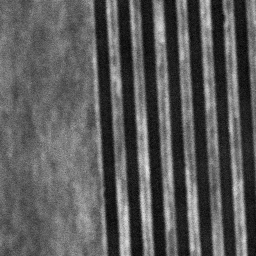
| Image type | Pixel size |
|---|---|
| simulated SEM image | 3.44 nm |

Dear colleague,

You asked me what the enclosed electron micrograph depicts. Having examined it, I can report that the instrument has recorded parallel lines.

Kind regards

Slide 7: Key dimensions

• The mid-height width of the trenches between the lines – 48.1 nanometres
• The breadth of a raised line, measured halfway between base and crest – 30.1 nm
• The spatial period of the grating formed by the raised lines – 79.9 nanometres